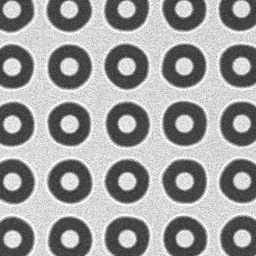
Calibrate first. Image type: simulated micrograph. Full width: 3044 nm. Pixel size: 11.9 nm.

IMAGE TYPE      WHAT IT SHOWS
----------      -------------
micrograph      an array of small figures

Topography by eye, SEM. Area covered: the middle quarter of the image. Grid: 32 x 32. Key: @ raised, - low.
@@@----@@@----@@@@---@@@----@@@@
@@@----@@@----@@@@---@@@----@@@@
@@@----@@@----@@@----@@@-----@@-
------@@@@@----------@@@@-------
------@@@@@@--------@@@@@@------
-----@@@@@@@@------@@@@@@@@-----
@@@@@@@@@@@@@@@-@@@@@@@@@@@@@@@@
@@@@@@@@@@@@@@@@@@@@@@@@@@@@@@@@
@@@@@@@@@@@@@@@@@@@@@@@@@@@@@@@@
--@@@@@@@@@@@@---@@@@@@@@@@@----
-----@@@@@@@-------@@@@@@@------
------@@@@@@--------@@@@@-------
------@@@@@----------@@@@-------
@@@----@@@@---@@@----@@@@----@@@
@@@----@@@----@@@@---@@@----@@@@
@@@----@@@----@@@@---@@@----@@@@
@@@----@@@@---@@@----@@@@----@@@
------@@@@@----------@@@@-------
------@@@@@----------@@@@@------
-----@@@@@@@--------@@@@@@@-----
---@@@@@@@@@@@----@@@@@@@@@@@--@
@@@@@@@@@@@@@@@@@@@@@@@@@@@@@@@@
@@@@@@@@@@@@@@@@@@@@@@@@@@@@@@@@
@@@@@@@@@@@@@@@@@@@@@@@@@@@@@@@@
----@@@@@@@@@-----@@@@@@@@@-----
------@@@@@@--------@@@@@@------
------@@@@@----------@@@@-------
@@@----@@@-----@@----@@@@----@@-
@@@----@@@----@@@@---@@@----@@@@
@@@@---@@@----@@@@---@@@----@@@@
@@@----@@@----@@@@---@@@@---@@@@
-@-----@@@-----@@----@@@@-------